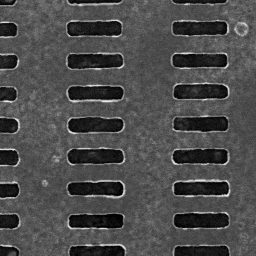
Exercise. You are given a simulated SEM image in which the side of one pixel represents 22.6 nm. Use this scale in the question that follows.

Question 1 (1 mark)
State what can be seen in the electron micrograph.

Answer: a regular array of holes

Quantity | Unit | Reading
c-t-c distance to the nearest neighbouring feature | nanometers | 721